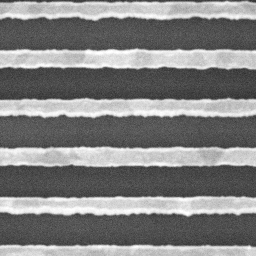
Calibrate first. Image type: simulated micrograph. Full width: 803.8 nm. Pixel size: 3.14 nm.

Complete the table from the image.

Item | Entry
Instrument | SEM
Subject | lines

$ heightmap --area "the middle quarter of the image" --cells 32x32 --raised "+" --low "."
++++++++++.+++++++++++++++++++++
................................
................................
................................
................................
................................
................................
................................
................................
++++++++++++++++++++++++++++++++
++++++++++++++++++++++++++++++++
++++++++++++++++++++++++++++++++
++++++++++..++++....++..++++....
................................
................................
................................
................................
................................
................................
................................
................................
++++++++++++++++++++++++++++++++
++++++++++++++++++++++++++++++++
++++++++++++++++++++++++++++++++
++++++++++++++++++++++++++++++++
................................
................................
................................
................................
................................
................................
................................